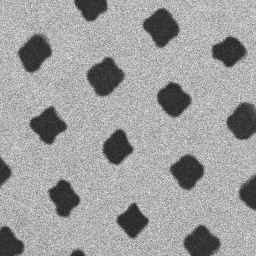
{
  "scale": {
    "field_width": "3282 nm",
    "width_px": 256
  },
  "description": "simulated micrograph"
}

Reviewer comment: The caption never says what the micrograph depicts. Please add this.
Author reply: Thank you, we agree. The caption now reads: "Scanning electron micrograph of a regular array of holes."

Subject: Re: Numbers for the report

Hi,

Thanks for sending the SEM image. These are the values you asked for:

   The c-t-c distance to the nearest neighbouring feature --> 923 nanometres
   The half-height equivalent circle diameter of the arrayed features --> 31.2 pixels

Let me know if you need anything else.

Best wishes